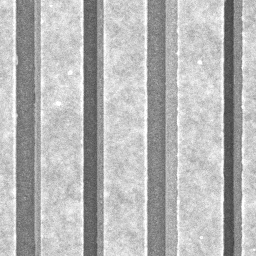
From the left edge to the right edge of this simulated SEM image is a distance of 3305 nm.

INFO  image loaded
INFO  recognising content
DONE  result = lines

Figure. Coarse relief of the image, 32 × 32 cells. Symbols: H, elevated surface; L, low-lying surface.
HHLLLHHHHHLLLHHHHHLLLLHHHHHHLLHH
HHLLLHHHHHLLLHHHHHLLLLHHHHHHLLHH
HHLLLHHHHHLLLHHHHHLLLLHHHHHHLLHH
HHLLLHHHHHLLLHHHHHLLLLHHHHHHLLHH
HHLLLHHHHHLLLHHHHHLLLLHHHHHHLLHH
HHLLLHHHHHLLLHHHHHLLLLHHHHHHLLHH
HHLLLHHHHHLLLHHHHHLLLLHHHHHHLLHH
HHLLLHHHHHLLLHHHHHLLLLHHHHHHLLHH
HHLLLHHHHHLLLHHHHHLLLLHHHHHHLLHH
HHLLLHHHHHLLLHHHHHLLLLHHHHHHLLHH
HHLLLHHHHHLLLHHHHHLLLLHHHHHHLLHH
HHLLLHHHHHLLLHHHHHLLLLHHHHHHLLHH
HHLLLHHHHHLLLHHHHHLLLLHHHHHHLLHH
HHLLLHHHHHLLLHHHHHLLLLHHHHHHLLHH
HHLLLHHHHHLLLHHHHHLLLLHHHHHHLLHH
HHLLLHHHHHLLLHHHHHLLLLHHHHHHLLHH
HHLLLHHHHHLLLHHHHHLLLLHHHHHHLLHH
HHLLLHHHHHLLLHHHHHLLLLHHHHHHLLHH
HHLLLHHHHHLLLHHHHHLLLLHHHHHHLLHH
HHLLLHHHHHLLLHHHHHLLLLHHHHHHLLHH
HHLLLHHHHHLLLHHHHHLLLLHHHHHHLLHH
HHLLLHHHHHLLLHHHHHLLLLHHHHHHLLHH
HHLLLHHHHHLLLHHHHHLLLLHHHHHHLLHH
HHLLLHHHHHLLLHHHHHLLLLHHHHHHLLHH
HHLLLHHHHHLLLHHHHHLLLLHHHHHHLLHH
HHLLLHHHHHLLLHHHHHLLLLHHHHHHLLHH
HHLLLHHHHHLLLHHHHHLLLLHHHHHHLLHH
HHLLLHHHHHLLLHHHHHLLLLHHHHHHLLHH
HHLLLHHHHHLLLHHHHHLLLLHHHHHHLLHH
HHLLLHHHHHLLLHHHHHLLLLHHHHHHLLHH
HHLLLHHHHHLLLHHHHHLLLLHHHHHHLLHH
HHLLLHHHHHLLLHHHHHLLLLHHHHHHLLHH